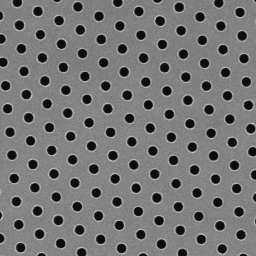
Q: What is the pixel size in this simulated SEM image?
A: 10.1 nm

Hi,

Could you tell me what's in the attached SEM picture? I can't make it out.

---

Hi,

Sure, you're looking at a regular array of holes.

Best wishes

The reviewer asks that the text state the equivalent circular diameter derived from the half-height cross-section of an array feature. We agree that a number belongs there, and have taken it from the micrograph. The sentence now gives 91.8 nm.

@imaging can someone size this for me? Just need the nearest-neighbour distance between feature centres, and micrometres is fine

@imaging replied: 0.231